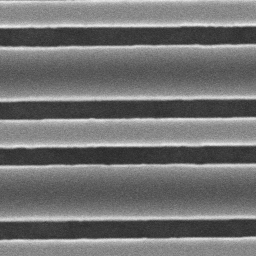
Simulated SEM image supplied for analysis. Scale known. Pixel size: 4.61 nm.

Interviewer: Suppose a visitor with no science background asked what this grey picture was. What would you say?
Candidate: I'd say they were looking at lines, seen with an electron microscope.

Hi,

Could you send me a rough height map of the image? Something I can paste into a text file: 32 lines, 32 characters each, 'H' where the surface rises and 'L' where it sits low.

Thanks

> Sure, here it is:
HHHHHHHHHHHHHHHHHHHHHHHHHHHHHHHH
HHHHHHHHHHHHHHHHHHHHHHHHHHHHHHHH
HHHHHHHHHHHHHHHHHHHHHHHHHHHHHHHH
LLLLLLLLLLLLLLLLLLLLLLLLLLLLLLLL
LLLLLLLLLLLLLLLLLLLLLLLLLLLLLLLL
LLLLLLLLLLLLLLLLLLLLLLLLLLLLLLLL
HHHHHHHHHHHHHHHHHHHHHHHHHHHHHHHH
HHHHHHHHHHHHHHHHHHHHHHHHHHHHHHHH
HHHHHHHHHHHHHHHHHHHHHHHHHHHHHHHH
HHHHHHHHHHHHHHHHHHHHHHHHHHHHHHHH
HHHHHHHHHHHHHHHHHHHHHHHHHHHHHHHH
HHHHHHHHHHHHHHHHHHHHHHHHHHHHHHHH
HHHHHHHHHLLLLLLLLLLLLLLLLLLLLLLL
LLLLLLLLLLLLLLLLLLLLLLLLLLLLLLLL
LLLLLLLLLLLLLLLLLLLLLLLLLLLLLLLL
HHHHHHHHHHHHHHHHHHHHHHHHHHHHHHHH
HHHHHHHHHHHHHHHHHHHHHHHHHHHHHHHH
HHHHHHHHHHHHHHHHHHHHHHHHHHHHHHHH
LLLLLLLLLLLLLLLLLLLLLLLLLLLLLLLL
LLLLLLLLLLLLLLLLLLLLLLLLLLLLLLLL
LLLLLLLLLLLLLLLLLLLLLLLLLLLLLLLL
HHHHHHHHHHHHHHHHHHHHHHHHHHHHHHHH
HHHHHHHHHHHHHHHHHHHHHHHHHHHHHHHH
HHHHHHHHHHHHHHHHHHHHHHHHHHHHHHHH
HHHHHHHHHHHHHHHHHHHHHHHHHHHHHHHH
HHHHHHHHHHHHHHHHHHHHHHHHHHHHHHHH
HHHHHHHHHHHHHHHHHHHHHHHHHHHHHHHH
HHHHHHHHHHHHHLLLLLLLLLLLLLLLLLLL
LLLLLLLLLLLLLLLLLLLLLLLLLLLLLLLL
LLLLLLLLLLLLLLLLLLLLLLLLLLLLLLLL
HHHHHHHHHHHHHHHHHHHHHHHHHHHHHHHH
HHHHHHHHHHHHHHHHHHHHHHHHHHHHHHHH